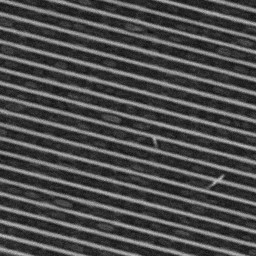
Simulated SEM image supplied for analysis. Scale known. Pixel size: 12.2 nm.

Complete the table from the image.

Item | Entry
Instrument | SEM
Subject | parallel lines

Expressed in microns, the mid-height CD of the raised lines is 0.0251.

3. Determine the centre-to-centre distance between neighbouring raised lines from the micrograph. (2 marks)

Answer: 13.4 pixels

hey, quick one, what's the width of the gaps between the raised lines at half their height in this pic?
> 0.132 um